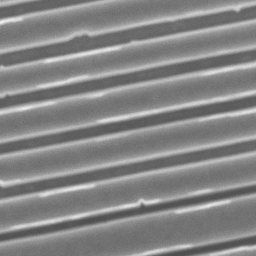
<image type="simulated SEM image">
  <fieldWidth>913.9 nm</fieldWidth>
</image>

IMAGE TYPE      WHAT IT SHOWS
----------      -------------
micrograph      parallel lines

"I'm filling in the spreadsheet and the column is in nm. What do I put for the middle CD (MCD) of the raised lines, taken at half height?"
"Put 110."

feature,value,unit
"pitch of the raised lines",0.158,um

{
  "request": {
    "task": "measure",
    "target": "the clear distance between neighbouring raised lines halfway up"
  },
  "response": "48.2 nm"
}